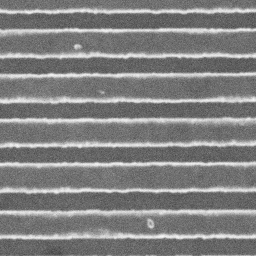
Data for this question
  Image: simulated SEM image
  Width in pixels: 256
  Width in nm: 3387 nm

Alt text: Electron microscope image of lines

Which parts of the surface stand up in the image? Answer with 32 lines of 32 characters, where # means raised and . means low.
################################
########...#############.##...#.
................................
................................
################################
################################
################################
................................
................................
################################
################################
################################
################################
................................
................................
################################
################################
################################
................................
................................
####...#########################
################################
################################
################################
................................
................................
#..........##.#....#############
################################
################################
###########..###################
................................
................................